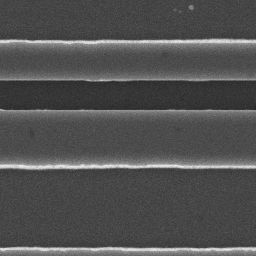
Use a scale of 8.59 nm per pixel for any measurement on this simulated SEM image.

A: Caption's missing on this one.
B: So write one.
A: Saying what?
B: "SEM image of lines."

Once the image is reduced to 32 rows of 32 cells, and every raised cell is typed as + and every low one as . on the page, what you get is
................................
................................
................................
................................
................................
++++++++++++++++++++++++++++++++
++++++++++++++++++++++++++++++++
++++++++++++++++++++++++++++++++
++++++++++++++++++++++++++++++++
++++++++++++++++++++++++++++++++
................................
................................
................................
................................
++++++++++++++++++++++++++++++++
++++++++++++++++++++++++++++++++
++++++++++++++++++++++++++++++++
++++++++++++++++++++++++++++++++
++++++++++++++++++++++++++++++++
++++++++++++++++++++++++++++++++
++++++++++++++++++++++++++++++++
................................
................................
................................
................................
................................
................................
................................
................................
................................
................................
++++++++++++++++++++++++++++++++